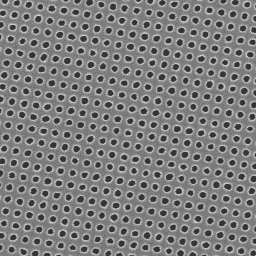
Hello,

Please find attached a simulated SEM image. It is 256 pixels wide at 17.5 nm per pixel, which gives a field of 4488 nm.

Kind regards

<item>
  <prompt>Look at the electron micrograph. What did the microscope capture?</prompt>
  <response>a regular array of holes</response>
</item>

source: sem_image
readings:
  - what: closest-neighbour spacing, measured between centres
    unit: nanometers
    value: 206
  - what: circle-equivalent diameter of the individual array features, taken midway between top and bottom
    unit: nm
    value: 108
